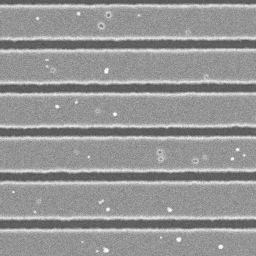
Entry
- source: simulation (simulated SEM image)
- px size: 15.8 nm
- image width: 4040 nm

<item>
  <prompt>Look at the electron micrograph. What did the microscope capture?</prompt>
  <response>lines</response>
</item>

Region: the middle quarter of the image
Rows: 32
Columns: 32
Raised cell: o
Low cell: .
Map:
oooooooooooooooooooooooooooooooo
oooooooooooooooooooooooooooooooo
oooooooooooooooooooooooooooooooo
oooooooooooooooooooooooooooooooo
oooooooooooooooooooooooooooooooo
................................
................................
oooooooooooooooooooooooooooooooo
oooooooooooooooooooooooooooooooo
oooooooooooooooooooooooooooooooo
oooooooooooooooooooooooooooooooo
oooooooooooooooooooooooooooooooo
oooooooooooooooooooooooooooooooo
oooooooooooooooooooooooooooooooo
oooooooooooooooooooooooooooooooo
oooooooooooooooooooooooooooooooo
................................
................................
oooooooooooooooooooooooooooooooo
oooooooooooooooooooooooooooooooo
oooooooooooooooooooooooooooooooo
oooooooooooooooooooooooooooooooo
oooooooooooooooooooooooooooooooo
oooooooooooooooooooooooooooooooo
oooooooooooooooooooooooooooooooo
oooooooooooooooooooooooooooooooo
oooooooooooooooooooooooooooooooo
................................
................................
oooooooooooooooooooooooooooooooo
oooooooooooooooooooooooooooooooo
oooooooooooooooooooooooooooooooo